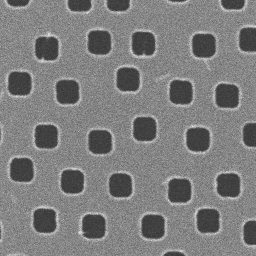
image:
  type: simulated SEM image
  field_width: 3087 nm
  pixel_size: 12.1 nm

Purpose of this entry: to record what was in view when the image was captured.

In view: a regular array of holes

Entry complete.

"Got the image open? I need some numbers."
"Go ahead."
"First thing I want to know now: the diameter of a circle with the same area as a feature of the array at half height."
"312 nanometres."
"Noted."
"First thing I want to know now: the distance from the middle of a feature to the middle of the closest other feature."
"0.551 microns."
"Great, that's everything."